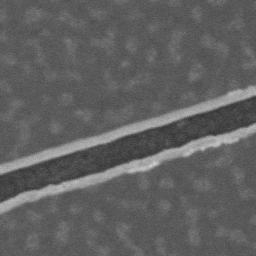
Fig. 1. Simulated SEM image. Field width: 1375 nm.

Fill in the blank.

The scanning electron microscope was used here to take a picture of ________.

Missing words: one or a few lines or trenches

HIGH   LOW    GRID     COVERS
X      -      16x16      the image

XXXXXXXXXXXXXXXX
XXXXXXXXXXXXXXXX
XXXXXXXXXXXXXXXX
XXXXXXXXXXXXXXXX
XXXXXXXXXXXXXXXX
XXXXXXXXXXXXXXXX
XXXXXXXXXXXXXX--
XXXXXXXXXX------
XXXXXXX-------XX
XXXX-------XXXXX
X-------XXXXXXXX
----XXXXXXXXXXXX
-XXXXXXXXXXXXXXX
XXXXXXXXXXXXXXXX
XXXXXXXXXXXXXXXX
XXXXXXXXXXXXXXXX